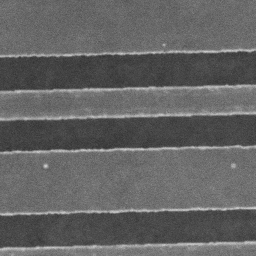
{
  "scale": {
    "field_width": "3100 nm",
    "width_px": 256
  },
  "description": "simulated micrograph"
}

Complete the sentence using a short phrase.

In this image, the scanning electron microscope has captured lines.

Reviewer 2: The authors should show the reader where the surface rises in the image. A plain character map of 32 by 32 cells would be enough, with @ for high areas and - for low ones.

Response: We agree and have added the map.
@@@@@@@@@@@@@@@@@@@@@@@@@@@@@@@@
@@@@@@@@@@@@@@@@@@@@@@@@@@@@@@@@
@@@@@@@@@@@@@@@@@@@@@@@@@@@@@@@@
@@@@@@@@@@@@@@@@@@@@@@@@@@@@@@@@
@@@@@@@@@@@@@@@@@@@@@@@@@@@@@@@@
@@@@@@@@@@@@@@@@@@@@@@@@@@@@@@@@
@@@@@@@@@@@@@@@@@@@@@@@@@-------
--------------------------------
--------------------------------
--------------------------------
--------------------------------
-@@@@@@@@@@@@@@@@@@@@@@@@@@@@@@@
@@@@@@@@@@@@@@@@@@@@@@@@@@@@@@@@
@@@@@@@@@@@@@@@@@@@@@@@@@@@@@@@@
@@@@@@@@@@@@@@@@@---------------
--------------------------------
--------------------------------
--------------------------------
----------------------@@@@@@@@@@
@@@@@@@@@@@@@@@@@@@@@@@@@@@@@@@@
@@@@@@@@@@@@@@@@@@@@@@@@@@@@@@@@
@@@@@@@@@@@@@@@@@@@@@@@@@@@@@@@@
@@@@@@@@@@@@@@@@@@@@@@@@@@@@@@@@
@@@@@@@@@@@@@@@@@@@@@@@@@@@@@@@@
@@@@@@@@@@@@@@@@@@@@@@@@@@@@@@@@
@@@@@@@@@@@@@@@@@@@@@@@@@@@@@@@@
@@@@@@@@@@@@@@@-----------------
--------------------------------
--------------------------------
--------------------------------
-------------------------@@@@@@@
@@@@@@@@@@@@@@@@@@@@@@@@@@@@@@@@